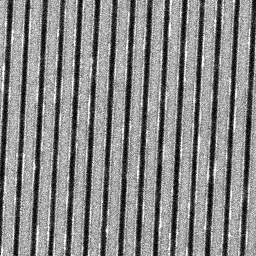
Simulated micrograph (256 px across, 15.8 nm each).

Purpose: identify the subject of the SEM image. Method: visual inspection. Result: parallel lines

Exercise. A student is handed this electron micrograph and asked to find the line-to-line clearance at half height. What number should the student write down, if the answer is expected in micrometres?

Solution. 0.158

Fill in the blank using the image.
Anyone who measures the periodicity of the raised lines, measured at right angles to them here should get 0.275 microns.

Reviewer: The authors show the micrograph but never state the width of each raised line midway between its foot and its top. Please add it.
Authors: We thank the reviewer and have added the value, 122 nm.